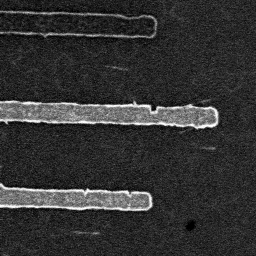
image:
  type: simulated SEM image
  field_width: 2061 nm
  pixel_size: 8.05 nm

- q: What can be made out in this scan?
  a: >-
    one or a few lines or trenches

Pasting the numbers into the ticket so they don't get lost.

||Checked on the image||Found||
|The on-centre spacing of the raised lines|704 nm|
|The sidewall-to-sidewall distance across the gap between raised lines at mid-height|553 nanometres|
